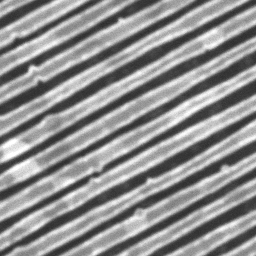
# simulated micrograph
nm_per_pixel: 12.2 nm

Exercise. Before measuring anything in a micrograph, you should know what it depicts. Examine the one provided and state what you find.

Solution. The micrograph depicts parallel lines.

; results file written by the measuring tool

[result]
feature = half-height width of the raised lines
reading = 166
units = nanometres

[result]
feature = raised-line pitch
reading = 0.308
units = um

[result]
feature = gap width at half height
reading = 142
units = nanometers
